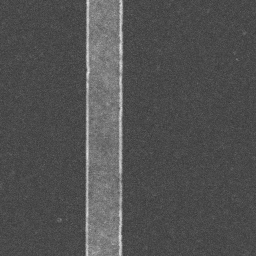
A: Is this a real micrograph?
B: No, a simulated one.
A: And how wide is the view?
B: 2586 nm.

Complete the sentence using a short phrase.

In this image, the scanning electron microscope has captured one or a few lines or trenches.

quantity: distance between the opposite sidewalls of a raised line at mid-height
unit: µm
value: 0.342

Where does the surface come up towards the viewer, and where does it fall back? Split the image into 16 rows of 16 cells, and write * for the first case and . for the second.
.....***........
.....***........
.....***........
.....***........
.....***........
.....***........
.....***........
.....***........
.....***........
.....***........
.....***........
.....***........
.....***........
.....***........
.....***........
.....***........